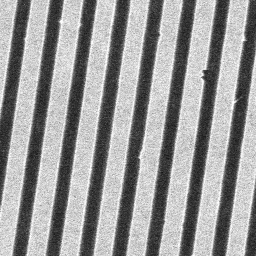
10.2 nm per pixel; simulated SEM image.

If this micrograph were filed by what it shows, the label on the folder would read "parallel lines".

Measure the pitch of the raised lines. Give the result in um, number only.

0.334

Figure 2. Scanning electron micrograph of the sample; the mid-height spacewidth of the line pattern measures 121 nanometers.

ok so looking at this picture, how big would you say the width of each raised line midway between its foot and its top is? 212 nm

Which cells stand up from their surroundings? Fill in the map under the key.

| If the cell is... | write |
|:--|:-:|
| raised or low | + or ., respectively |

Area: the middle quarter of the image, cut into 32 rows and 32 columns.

+++...+++++...+++++...+++++....+
++....+++++...+++++...+++++....+
++...++++++...+++++...+++++...++
++...+++++....+++++...+++++...++
++...+++++....++++....+++++...++
++...+++++...+++++....+++++...++
++...+++++...+++++....++++....++
++...+++++...+++++...+++++....++
+...++++++...+++++...+++++...+++
+...+++++....+++++...+++++...+++
+...+++++....+++++...+++++...+++
+...+++++....++++....+++++...+++
+...+++++...+++++....+++++...+++
+...+++++...+++++....++++....+++
....+++++...+++++...+++++...++++
...++++++...+++++...+++++...++++
...+++++....+++++...+++++...++++
...+++++....+++++...+++++...++++
...+++++....++++....+++++...++++
...+++++...+++++....+++++...++++
...+++++...+++++...+++++....++++
...+++++...+++++...+++++...+++++
..++++++...+++++...+++++...+++++
..+++++....+++++...+++++...+++++
..+++++....+++++...+++++...+++++
..+++++...+++++....+++++...+++++
..+++++...+++++....+++++...+++++
..+++++...+++++...+++++...++++++
..+++++...+++++...+++++...++++++
.++++++...+++++...+++++...++++++
.+++++....+++++...+++++...+++++.
.+++++....+++++...+++++...+++++.